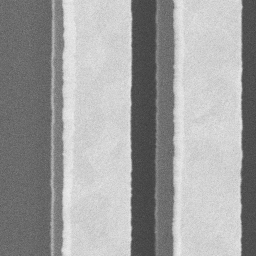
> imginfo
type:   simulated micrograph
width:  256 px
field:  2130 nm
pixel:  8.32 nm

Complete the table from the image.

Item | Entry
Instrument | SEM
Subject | lines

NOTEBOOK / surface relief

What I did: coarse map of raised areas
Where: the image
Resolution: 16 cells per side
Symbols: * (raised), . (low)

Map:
...*****..*****.
...*****..*****.
...*****..*****.
...*****..*****.
...*****..*****.
...*****..*****.
...*****..*****.
...*****..*****.
...*****..*****.
...*****..*****.
...*****..*****.
...*****..*****.
...*****..*****.
...*****..*****.
...*****..*****.
...*****..*****.